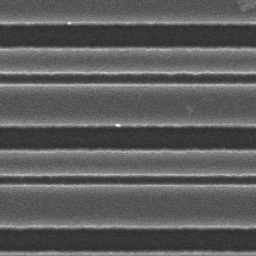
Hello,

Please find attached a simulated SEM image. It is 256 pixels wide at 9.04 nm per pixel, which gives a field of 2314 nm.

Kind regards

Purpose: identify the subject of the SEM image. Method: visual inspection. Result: lines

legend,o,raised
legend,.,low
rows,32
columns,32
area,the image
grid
oooooooooooooooooooooooooooooooo
oooooooooooooooooooooooooooooooo
oooooooooooooooooooooooooooooooo
................................
................................
................................
oooooooooooooooooooooooooooooooo
oooooooooooooooooooooooooooooooo
oooooooooooooooooooooooooooooooo
oooooooooooooooooooooooooooooooo
oooooooooooooooooooooooooooooooo
oooooooooooooooooooooooooooooooo
oooooooooooooooooooooooooooooooo
oooooooooooooooooooooooooooooooo
oooooooooooooooooooooooooooooooo
oooooooooooooooooooooooooooooooo
................................
................................
................................
oooooooooooooooooooooooooooooooo
oooooooooooooooooooooooooooooooo
oooooooooooooooooooooooooooooooo
oooooooooooooooooooooooooooooooo
oooooooooooooooooooooooooooooooo
oooooooooooooooooooooooooooooooo
oooooooooooooooooooooooooooooooo
oooooooooooooooooooooooooooooooo
oooooooooooooooooooooooooooooooo
................................
................................
................................
................................